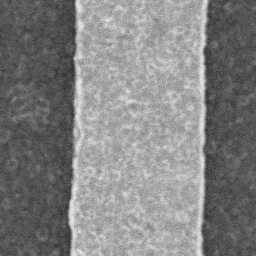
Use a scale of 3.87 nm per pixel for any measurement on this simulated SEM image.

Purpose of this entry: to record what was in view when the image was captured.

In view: one or a few lines or trenches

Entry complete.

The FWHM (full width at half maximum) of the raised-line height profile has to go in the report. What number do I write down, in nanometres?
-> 484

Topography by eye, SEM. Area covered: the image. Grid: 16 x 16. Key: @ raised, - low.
-----@@@@@@@@---
-----@@@@@@@@---
-----@@@@@@@@---
-----@@@@@@@@---
-----@@@@@@@@---
-----@@@@@@@@---
-----@@@@@@@@---
-----@@@@@@@@---
-----@@@@@@@@---
-----@@@@@@@@---
-----@@@@@@@@---
-----@@@@@@@@---
-----@@@@@@@@---
----@@@@@@@@----
-----@@@@@@@----
-----@@@@@@@----